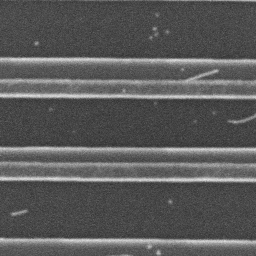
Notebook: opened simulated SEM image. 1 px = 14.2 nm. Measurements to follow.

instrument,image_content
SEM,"lines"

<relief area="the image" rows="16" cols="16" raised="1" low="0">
0000000000000000
0000000000000000
0000000000000000
0000000000000000
1111111111111111
1111111111111111
0000000000000000
0000000000000000
0000000000000000
1111111111111111
1111111111111111
0000000000000000
0000000000000000
0000000000000000
0000000000000000
1111111111111111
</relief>